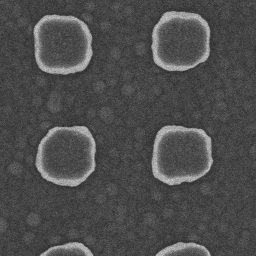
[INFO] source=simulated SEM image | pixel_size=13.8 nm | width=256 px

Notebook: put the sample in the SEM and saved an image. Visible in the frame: raised bodies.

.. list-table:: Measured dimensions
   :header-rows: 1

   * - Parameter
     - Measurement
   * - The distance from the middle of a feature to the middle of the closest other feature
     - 1550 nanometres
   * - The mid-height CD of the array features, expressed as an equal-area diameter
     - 0.799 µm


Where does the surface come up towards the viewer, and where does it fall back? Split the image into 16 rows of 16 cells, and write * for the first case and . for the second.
................
..***.....***...
..****....***...
..****....***...
................
................
................
................
...***....***...
..****....***...
..****....***...
................
................
................
................
...**......**...